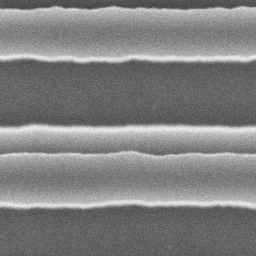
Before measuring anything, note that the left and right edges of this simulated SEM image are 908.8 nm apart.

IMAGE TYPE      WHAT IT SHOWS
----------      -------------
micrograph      lines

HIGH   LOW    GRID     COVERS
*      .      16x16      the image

****************
****************
****************
*.**************
................
................
................
................
****************
****************
****************
****************
****************
................
................
................